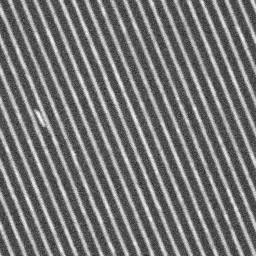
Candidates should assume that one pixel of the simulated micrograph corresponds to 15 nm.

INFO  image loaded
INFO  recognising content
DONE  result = parallel lines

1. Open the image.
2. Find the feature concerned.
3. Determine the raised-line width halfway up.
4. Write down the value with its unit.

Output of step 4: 38.1 nm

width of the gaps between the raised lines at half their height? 0.14 µm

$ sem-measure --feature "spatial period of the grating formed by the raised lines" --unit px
11.8